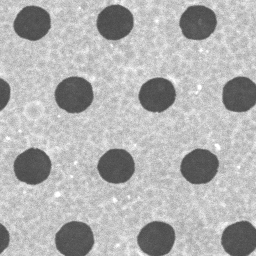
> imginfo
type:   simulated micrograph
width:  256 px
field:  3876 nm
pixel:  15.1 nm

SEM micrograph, a regular array of holes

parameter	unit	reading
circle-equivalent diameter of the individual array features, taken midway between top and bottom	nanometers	560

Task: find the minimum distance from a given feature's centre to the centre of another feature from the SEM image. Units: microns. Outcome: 1.25